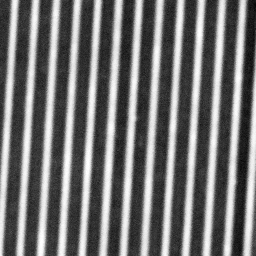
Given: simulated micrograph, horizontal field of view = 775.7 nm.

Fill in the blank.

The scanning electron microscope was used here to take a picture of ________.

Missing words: parallel lines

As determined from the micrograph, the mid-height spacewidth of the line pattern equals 44.2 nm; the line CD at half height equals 19.3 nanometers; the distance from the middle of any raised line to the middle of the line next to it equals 62.5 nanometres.